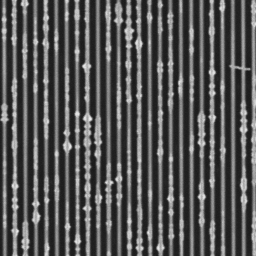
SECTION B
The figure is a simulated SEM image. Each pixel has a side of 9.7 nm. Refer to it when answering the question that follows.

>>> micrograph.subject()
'parallel lines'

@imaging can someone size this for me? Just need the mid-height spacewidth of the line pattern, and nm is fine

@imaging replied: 65.4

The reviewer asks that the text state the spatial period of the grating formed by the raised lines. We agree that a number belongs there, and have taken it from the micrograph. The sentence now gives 101 nm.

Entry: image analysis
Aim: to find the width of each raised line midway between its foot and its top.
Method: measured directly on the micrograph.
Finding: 36.4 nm